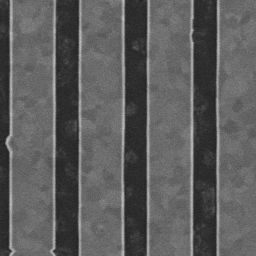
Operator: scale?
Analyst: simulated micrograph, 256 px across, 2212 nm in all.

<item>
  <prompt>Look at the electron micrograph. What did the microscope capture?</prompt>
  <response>one or a few lines or trenches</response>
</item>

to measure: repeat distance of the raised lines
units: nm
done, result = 594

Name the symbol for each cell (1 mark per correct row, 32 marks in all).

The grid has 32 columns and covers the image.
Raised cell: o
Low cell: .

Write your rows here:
.oooooo...ooooo....ooooo...ooooo
.oooooo...ooooo....ooooo...ooooo
.oooooo...ooooo....ooooo...ooooo
.oooooo...ooooo....ooooo...ooooo
.oooooo...ooooo....ooooo...ooooo
.oooooo...ooooo....ooooo...ooooo
.oooooo...ooooo....ooooo...ooooo
.oooooo...ooooo...oooooo...ooooo
.oooooo...ooooo...oooooo...ooooo
.oooooo...ooooo....ooooo...ooooo
.oooooo...ooooo....ooooo...ooooo
.oooooo...ooooo....ooooo...ooooo
.oooooo...ooooo....ooooo...ooooo
.oooooo...ooooo....ooooo...ooooo
.oooooo...ooooo....ooooo...ooooo
.oooooo...ooooo....ooooo...ooooo
.oooooo...ooooo....ooooo...ooooo
.oooooo...ooooo....ooooo...ooooo
.oooooo...ooooo....ooooo...ooooo
.oooooo...ooooo....ooooo...ooooo
.oooooo...ooooo....ooooo...ooooo
.oooooo...ooooo....ooooo...ooooo
.oooooo...ooooo....ooooo...ooooo
.oooooo...ooooo....ooooo...ooooo
.oooooo...ooooo....ooooo...ooooo
.oooooo...ooooo....ooooo...ooooo
.oooooo...ooooo....ooooo...ooooo
.oooooo...ooooo....ooooo...ooooo
.oooooo...ooooo....ooooo...ooooo
.oooooo...ooooo....ooooo...ooooo
.oooooo...ooooo....ooooo...ooooo
..ooooo...ooooo....ooooo...ooooo